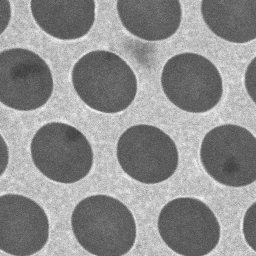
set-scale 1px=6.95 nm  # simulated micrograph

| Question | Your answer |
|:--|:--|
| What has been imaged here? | holes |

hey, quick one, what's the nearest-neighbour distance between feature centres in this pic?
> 581 nm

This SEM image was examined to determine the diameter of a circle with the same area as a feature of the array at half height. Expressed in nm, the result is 426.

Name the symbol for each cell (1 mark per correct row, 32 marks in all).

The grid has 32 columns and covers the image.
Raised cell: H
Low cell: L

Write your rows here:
LHHHLLLLLLLLHHHLLLLLLLLHHLLLLLLL
LHHHLLLLLLLLHHHLLLLLLLLHHLLLLLLL
LHHHLLLLLLLLHHHLLLLLLLLHHLLLLLLL
LHHHHLLLLLLHHHHHLLLLLLHHHHLLLLLL
HHHHHHLLLLHHHHHHHLLLLHHHHHHLLLLL
HHHHHHHHHHHHHHHHHHHHHHHHHHHHHHHH
LLLLHHHHHHHLLLHHHHHHHHHHHHHHHHHH
LLLLLHHHHHLLLLLHHHHHHLLLLLHHHHHH
LLLLLLHHHLLLLLLLHHHHLLLLLLLHHHHL
LLLLLLHHHLLLLLLLLHHHLLLLLLLLHHHL
LLLLLLLHHLLLLLLLLHHHLLLLLLLLHHHL
LLLLLLLHHHLLLLLLLHHHLLLLLLLLHHHL
LLLLLLHHHHLLLLLLLHHHHLLLLLLHHHHH
HLLLLHHHHHHLLLLLHHHHHHLLLLLHHHHH
HHHHHHHHHHHHHHHHHHHHHHHHHHHHHHHH
HHHHHHLLHHHHHHHHHHHHHHHHHHHHHHHH
HHHHHLLLLLHHHHHLLLLLLHHHHHLLLLLH
LHHHLLLLLLLHHHHLLLLLLLHHHLLLLLLL
LHHHLLLLLLLHHHHLLLLLLLHHHLLLLLLL
LHHHLLLLLLLLHHHLLLLLLLHHHLLLLLLL
LHHHLLLLLLLHHHHLLLLLLLHHHLLLLLLL
HHHHHLLLLLLHHHHHLLLLLLHHHHLLLLLL
HHHHHHLLLLHHHHHHHLLLLHHHHHHLLLLL
HHHHHHHHHHHHHHHHHHHHHHHHHHHHHHHH
LLLHHHHHHHHLLLHHHHHHHHHHHHHHHHHH
LLLLLHHHHHLLLLLHHHHHHLLLLLHHHHHH
LLLLLLHHHLLLLLLLHHHHLLLLLLLHHHHL
LLLLLLHHHLLLLLLLLHHHLLLLLLLHHHLL
LLLLLLHHHLLLLLLLLHHHLLLLLLLLHHLL
LLLLLLHHHLLLLLLLLHHHLLLLLLLLHHHL
LLLLLLHHHHLLLLLLLHHHHLLLLLLHHHHL
HLLLLHHHHHHLLLLLHHHHHHLLLLHHHHHH